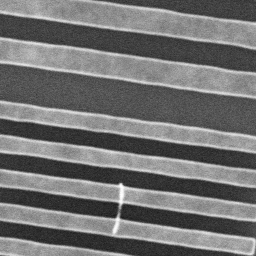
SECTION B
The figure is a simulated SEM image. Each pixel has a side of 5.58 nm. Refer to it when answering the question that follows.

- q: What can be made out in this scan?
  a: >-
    groups of lines, slits or small figures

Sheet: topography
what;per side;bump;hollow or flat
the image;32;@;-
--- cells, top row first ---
@@@@@@@@@@@@@@------------------
@@@@@@@@@@@@@@@@@@@@@@----------
------@@@@@@@@@@@@@@@@@@@@@@----
-------------@@@@@@@@@@@@@@@@@@@
---------------------@@@@@@@@@@@
@@@@@@-----------------------@@@
@@@@@@@@@@@@@-------------------
@@@@@@@@@@@@@@@@@@@@------------
-----@@@@@@@@@@@@@@@@@@@@@@-----
------------@@@@@@@@@@@@@@@@@@@@
-------------------@@@@@@@@@@@@@
--------------------------@@@@@@
--------------------------------
@@@@@---------------------------
@@@@@@@@@@@@@-------------------
-----@@@@@@@@@@@@@@@@-----------
--------------@@@@@@@@@@@@@@----
@@@@----------------@@@@@@@@@@@@
@@@@@@@@@@@@---------------@@@@@
----@@@@@@@@@@@@@@--------------
-----------@@@@@@@@@@@@@@@------
@@----------------@@@@@@@@@@@@@@
@@@@@@@@@-----------------@@@@@@
--@@@@@@@@@@@@@@@---------------
---------@@@@@@@@@@@@@@@--------
@---------------@@@@@@@@@@@@@@@-
@@@@@@@@---------------@@@@@@@@@
@@@@@@@@@@@@@@@---------------@@
------@@@@@@@@@@@@@@@@----------
--------------@@@@@@@@@@@@@@@@--
@@@@@@----------------@@@@@@@@@@
@@@@@@@@@@@@@----------------@@@